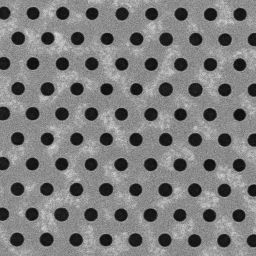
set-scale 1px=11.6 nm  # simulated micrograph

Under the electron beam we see a regular array of holes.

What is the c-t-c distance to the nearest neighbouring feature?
337 nm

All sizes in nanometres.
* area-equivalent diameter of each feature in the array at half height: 155